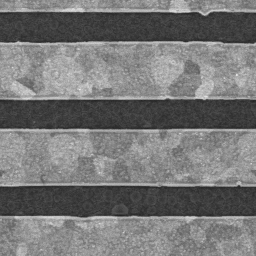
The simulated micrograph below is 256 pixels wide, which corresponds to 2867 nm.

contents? one or a few lines or trenches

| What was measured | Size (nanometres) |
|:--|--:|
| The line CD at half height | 613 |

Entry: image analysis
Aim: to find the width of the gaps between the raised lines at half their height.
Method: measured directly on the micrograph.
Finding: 0.36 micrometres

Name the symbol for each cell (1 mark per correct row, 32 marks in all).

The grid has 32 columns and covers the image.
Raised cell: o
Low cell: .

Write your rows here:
oooooooooooooooooooooooooooooooo
.........................o......
................................
................................
................................
oooo....oooooooooooooooooooo...o
oooooooooooooooooooooooooooooooo
oooooooooooooooooooooooooooooooo
oooooooooooooooooooooooooooooooo
oooooooooooooooooooooooooooooooo
oooooooooooooooooooooooooooooooo
oooooooooooooooooooooooooooooooo
................................
................................
................................
................................
oooooooooooooooooooooooooooooooo
oooooooooooooooooooooooooooooooo
oooooooooooooooooooooooooooooooo
oooooooooooooooooooooooooooooooo
oooooooooooooooooooooooooooooooo
oooooooooooooooooooooooooooooooo
oooooooooooooooooooooooooooooooo
................................
................................
................................
................................
oooooooooooooooooooooooooooooooo
oooooooooooooooooooooooooooooooo
oooooooooooooooooooooooooooooooo
oooooooooooooooooooooooooooooooo
oooooooooooooooooooooooooooooooo